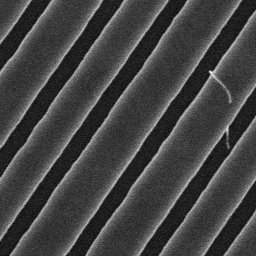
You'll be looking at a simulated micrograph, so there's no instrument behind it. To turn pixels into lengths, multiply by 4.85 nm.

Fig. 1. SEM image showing lines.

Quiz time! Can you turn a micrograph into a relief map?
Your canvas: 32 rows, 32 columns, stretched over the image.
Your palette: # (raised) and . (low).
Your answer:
####..#######..######..#######..
###...######...#####..#######...
##...######...#####...#######..#
#...#######..######..#######..##
#..#######..######..#######...##
...######...#####...######...###
..######...######..#######..####
.#######..######..#######...####
#######...#####...######...#####
######...#####...#######..######
######..######..#######...######
#####..######...######...#######
####...#####...#######..#######.
####..######..#######..#######..
###...#####..#######...######...
##...#####...######...#######..#
#...#####...#######..#######...#
#..######..#######...######...##
...#####...######...#######..###
..#####...#######..#######..####
.######..#######...######...####
.#####..#######...#######..#####
#####...#######..#######..######
#####..#######..#######...#####.
####..#######...######...######.
###...#######..#######..######..
##...#######..#######...#####...
##..#######...######...#####...#
#...#######..#######..######..##
...#######..#######...#####...##
..#######..#######...#####...###
.########..#######..######..####